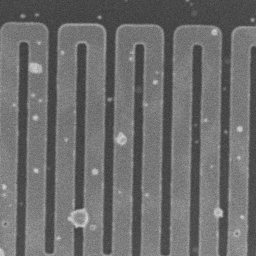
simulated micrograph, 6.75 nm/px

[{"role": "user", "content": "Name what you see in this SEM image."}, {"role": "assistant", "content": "groups of lines, slits or small figures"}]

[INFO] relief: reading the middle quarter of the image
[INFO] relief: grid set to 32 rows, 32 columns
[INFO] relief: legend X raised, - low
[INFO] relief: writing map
XXX---XXXX---XXXXX--XXXXX--XXXXX
XXX---XXXX---XXXXX--XXXXX--XXXXX
XXX---XXXX---XXXXX--XXXXX--XXXXX
XXX---XXXX---XXXX---XXXXX--XXXXX
XXX---XXXX---XXXX---XXXXX--XXXXX
XXX---XXXX---XXXX---XXXXX--XXXXX
XXX---XXXX---XXXX---XXXXX--XXXXX
XXX---XXXX---XXXX---XXXX---XXXXX
XXX---XXXX---XXXX---XXXX---XXXXX
XXX---XXXX---XXXX---XXXX---XXXXX
XXX---XXXX---XXXX---XXXX---XXXXX
XXX---XXXX---XXXX---XXXX---XXXXX
XXX---XXXX---XXXX---XXXX---XXXXX
XXX---XXXX---XXXX---XXXX---XXXXX
XXX---XXXX---XXXX---XXXX---XXXXX
XXX---XXXX---XXXX---XXXX---XXXXX
XXX---XXXX---XXXX---XXXX---XXXXX
XXX---XXXX---XXXX---XXXX---XXXXX
XXX---XXXX---XXXX---XXXX---XXXXX
XXX---XXXX---XXXX---XXXX---XXXXX
XXX---XXXX---XXXX---XXXX---XXXXX
XXX--XXXXX---XXXX---XXXX---XXXX-
XXX--XXXXX---XXXX---XXXX---XXXX-
XXX--XXXXX---XXXX---XXXX---XXXX-
XXX--XXXXX---XXXX---XXXX---XXXX-
XXX--XXXXX---XXXX---XXXX---XXXX-
XX---XXXXX---XXXX---XXXX---XXXX-
XX---XXXXX---XXXX---XXXX---XXXX-
XX---XXXXX---XXXX---XXXX---XXXX-
XX---XXXXX---XXXX---XXXX---XXXX-
XX---XXXXX---XXXX---XXXX---XXXX-
XX---XXXXX---XXXX---XXXX---XXXX-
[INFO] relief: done